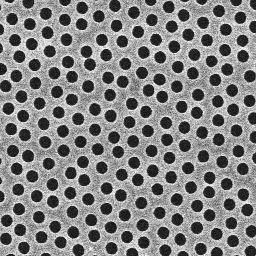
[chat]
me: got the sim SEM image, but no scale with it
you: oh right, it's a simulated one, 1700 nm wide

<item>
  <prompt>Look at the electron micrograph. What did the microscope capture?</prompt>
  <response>a regular array of holes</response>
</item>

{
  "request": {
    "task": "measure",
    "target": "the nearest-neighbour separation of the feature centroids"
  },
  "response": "117 nm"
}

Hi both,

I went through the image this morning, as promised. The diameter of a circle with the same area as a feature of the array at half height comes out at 80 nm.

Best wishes